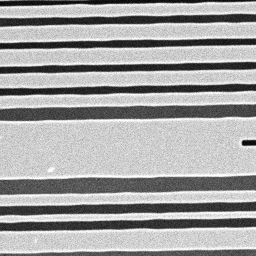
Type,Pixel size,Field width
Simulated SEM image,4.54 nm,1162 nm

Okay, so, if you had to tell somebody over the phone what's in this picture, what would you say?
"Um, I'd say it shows groups of lines, slits or small figures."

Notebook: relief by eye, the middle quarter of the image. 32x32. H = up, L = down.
LLLLLLLLLLLLLLLLLLLLLLLLLLLLLLLL
LLLLLLLLLLLLLLLLLLLLLLLLLLLLLLLL
HHHHHHHHHHHHHHHHHHHHHHHHHHHHHHHH
HHHHHHHHHHHHHHHHHHHHHHHHHHHHHHHH
HHHHHHHHHHHHHHHHHHHHHHHHHHHHHHHH
HHHHLLLLLLLLLLLLLLLLLLLLLLLLLLLL
LLLLLLLLLLLLLLLLLLLLLLLLLLLLLLLL
LLLLLLLLLLLLHHHHHLLLHHHHHHHHHHHH
HHHHHHHHHHHHHHHHHHHHHHHHHHHHHHHH
HHHHHHHHHHHHHHHHHHHHHHHHHHHHHHHH
HHHHHHHHHHHHHHHHLLLLLLLLLLLLLLLL
LLLLLLLLLLLLLLLLLLLLLLLLLLLLLLLL
LLLLLLLLLLLLLLLLLLLLLLLLLLLLLLLL
LLLLLLLLLLLLLLLLLLLLLLLLLLLLLLLL
HHHHHHHHHHHHHHHHHHHHHHHHHHHHHHHH
HHHHHHHHHHHHHHHHHHHHHHHHHHHHHHHH
HHHHHHHHHHHHHHHHHHHHHHHHHHHHHHHH
HHHHHHHHHHHHHHHHHHHHHHHHHHHHHHHH
HHHHHHHHHHHHHHHHHHHHHHHHHHHHHHHH
HHHHHHHHHHHHHHHHHHHHHHHHHHHHHHHH
HHHHHHHHHHHHHHHHHHHHHHHHHHHHHHHH
HHHHHHHHHHHHHHHHHHHHHHHHHHHHHHHH
HHHHHHHHHHHHHHHHHHHHHHHHHHHHHHHH
HHHHHHHHHHHHHHHHHHHHHHHHHHHHHHHH
HHHHHHHHHHHHHHHHHHHHHHHHHHHHHHHH
HHHHHHHHHHHHHHHHHHHHHHHHHHHHHHHH
HHHHHHHHHHHHHHHHHHHHHHHHHHHHHHHH
HHHHHHHHHHHHHHHHHHHHHHHHHHHHHHHH
LLLLLLLLLLLLLLLLLLLLLLLLLLLLLLLL
LLLLLLLLLLLLLLLLLLLLLLLLLLLLLLLL
LLLLLLLLLLLLLLLLLLLLLLLLLLLLLLLL
LLLLLLLLLLLLLLLLLLLLLLLLLLLLLLLL